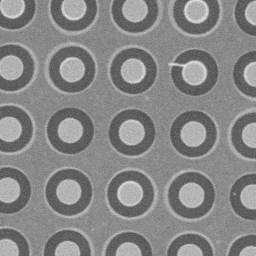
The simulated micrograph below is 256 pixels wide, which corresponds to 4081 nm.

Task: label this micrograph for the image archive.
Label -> an array of small figures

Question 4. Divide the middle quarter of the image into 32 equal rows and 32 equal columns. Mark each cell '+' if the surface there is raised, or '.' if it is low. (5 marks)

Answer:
+++++...+++....+++++...++++...++
+++++...+++....+++++...++++...++
+++++...+++....+++++...++++...++
++++....+++....++++....++++...++
.......+++++...........++++....+
......+++++++.........++++++....
.....+++++++++.......++++++++...
+.++++++++++++++...+++++++++++..
++++++++++++++++++++++++++++++++
++++++++++++++++++++++++++++++++
++++++++++++++++++++++++++++++++
....+++++++++++....+++++++++++++
......+++++++........++++++++...
......++++++..........++++++....
++++...+++++...+++....+++++.....
++++...++++...++++++...++++...++
+++++...+++...++++++...++++..+++
++++....+++...++++++...+++...+++
++++...++++...++++++...+++...+++
.......++++....++++...+++++...++
......++++++..........+++++.....
.....++++++++........+++++++....
...+++++++++++......+++++++++...
+++++++++++++++++++++++++++++++.
++++++++++++++++++++++++++++++++
++++++++++++++++++++++++++++++++
....+++++++++++....+++++++++++++
.....++++++++........+++++++....
......++++++..........+++++.....
+++....++++...........++++......
++++...++++...+++++....+++....++
++++...++++...+++++....++....+++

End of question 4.